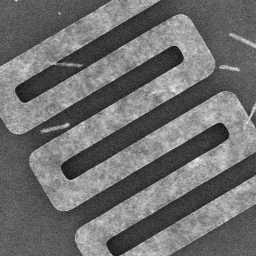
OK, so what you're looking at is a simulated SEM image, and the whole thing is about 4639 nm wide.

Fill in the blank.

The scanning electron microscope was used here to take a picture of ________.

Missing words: groups of lines, slits or small figures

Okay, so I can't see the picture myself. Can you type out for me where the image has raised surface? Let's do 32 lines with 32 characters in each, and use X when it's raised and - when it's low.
-------------XXXXXX-------------
------------XXXXXX--------------
----------XXXXXX-----XXX--------
--------XXXXXX-----XXXXX--------
-------XXXXXX----XXXXXXXX-------
-----XXXXXX-----XXXXXXXXXX------
---XXXXXX-----XXXXXX---XXX------
--XXXXX-----XXXXXX-----XXXX-----
XXXXXX-----XXXXXX-----XXXXX-----
XXXX-----XXXXXX-----XXXXXX------
XX-----XXXXXX-----XXXXXX--------
XX----XXXXXX-----XXXXXX-----X---
XXX-XXXXXX-----XXXXXX-----XXXX--
XXXXXXXX-----XXXXXX-----XXXXXX--
XXXXXXX-----XXXXXX-----XXXXXXXX-
-XXXX-----XXXXXX-----XXXXXX-XXXX
--X-----XXXXXX-----XXXXXX----XXX
-------XXXXXX----XXXXXXX----XXXX
-----XXXXXX-----XXXXXX-----XXXXX
----XXXXX-----XXXXXX-----XXXXXX-
----XXXX----XXXXXX-----XXXXXX---
----XXXX---XXXXXX-----XXXXXX----
-----XXXXXXXXXX-----XXXXXX-----X
-----XXXXXXXX-----XXXXXX-----XXX
------XXXXXX-----XXXXXX-----XXXX
-------XXX-----XXXXXX-----XXXXXX
-------------XXXXXX-----XXXXXX--
------------XXXXXX-----XXXXXX---
----------XXXXXX-----XXXXXX-----
---------XXXXX-----XXXXXX-------
----------XXX-----XXXXXX--------
----------XXXX--XXXXXX----------